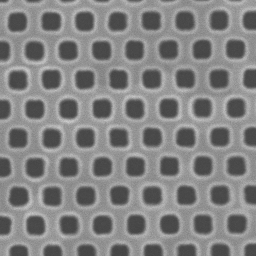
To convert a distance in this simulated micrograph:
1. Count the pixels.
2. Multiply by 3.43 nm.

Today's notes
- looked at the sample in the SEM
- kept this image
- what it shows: a regular array of holes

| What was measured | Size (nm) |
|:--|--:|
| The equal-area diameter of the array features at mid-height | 70.3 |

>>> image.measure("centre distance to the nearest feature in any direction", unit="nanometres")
114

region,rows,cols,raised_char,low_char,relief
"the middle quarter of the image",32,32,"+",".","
++++++++++++++++++++++++++++++++
++++++++++++.++++++++..++++++...
+++....++++.....++++....++++....
+++.....+++.....+++.....++++....
+++.....+++.....+++.....++++....
+++....++++.....++++....++++....
++++++++++++++++++++++++++++++++
++++++++++++++++++++++++++++++++
+++++++++++++++++++++++++..+++++
...++++.....++++....++++....++++
....+++.....+++.....++++.....+++
....+++.....+++.....++++.....+++
...++++.....++++....++++....++++
...+++++...++++++...+++++..+++++
++++++++++++++++++++++++++++++++
++++++++++++++++++++++++++++++++
++++...+++++....++++....+++++...
+++.....+++.....++++....++++....
+++.....+++.....++++....++++....
+++.....+++.....++++.....+++....
++++...+++++....++++....+++++...
++++++++++++++++++++++++++++++++
++++++++++++++++++++++++++++++++
.+++++++...+++++...++++++...++++
....+++.....++++....++++.....+++
....+++.....+++......+++.....+++
....+++.....+++.....++++.....+++
...++++.....++++....++++....++++
++++++++++++++++++++++++++++++++
++++++++++++++++++++++++++++++++
+++++.+++++++..++++++++++++++...
+++.....++++....++++....++++....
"